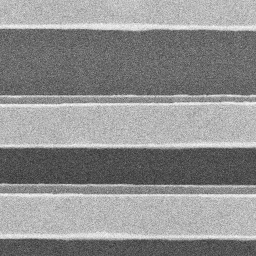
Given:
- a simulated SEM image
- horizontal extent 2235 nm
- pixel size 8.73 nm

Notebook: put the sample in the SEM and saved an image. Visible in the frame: lines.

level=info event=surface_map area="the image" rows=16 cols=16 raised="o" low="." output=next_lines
oooooooooooooooo
oooooooooooooooo
................
................
................
................
oooooooooooooooo
oooooooooooooooo
oooooooooooooooo
................
................
................
oooooooooooooooo
oooooooooooooooo
oooooooooooooooo
................